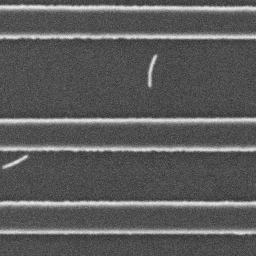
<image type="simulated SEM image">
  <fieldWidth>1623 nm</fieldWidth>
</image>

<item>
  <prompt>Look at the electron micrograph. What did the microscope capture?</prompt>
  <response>lines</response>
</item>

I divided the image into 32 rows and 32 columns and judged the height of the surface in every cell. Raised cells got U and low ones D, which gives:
DDDDDDDDDDDDDDDDDDDDDDDDDDDDDDDD
UUUUUUUUUUUUUUUUUUUUUUUUUUUUUUUU
UUUUUUUUUUUUUUUUUUUUUUUUUUUUUUUU
UUUUUUUUUUUUUUUUUUUUUUUUUUUUUUUU
UUUUUUUUUUUUUUUUUUUUUUUUUUUUUUUU
DDDDDDDDDDDDDDDDDDDDDDDDDDDDDDDD
DDDDDDDDDDDDDDDDDDDDDDDDDDDDDDDD
DDDDDDDDDDDDDDDDDDDDDDDDDDDDDDDD
DDDDDDDDDDDDDDDDDDDDDDDDDDDDDDDD
DDDDDDDDDDDDDDDDDDDDDDDDDDDDDDDD
DDDDDDDDDDDDDDDDDDDDDDDDDDDDDDDD
DDDDDDDDDDDDDDDDDDDDDDDDDDDDDDDD
DDDDDDDDDDDDDDDDDDDDDDDDDDDDDDDD
DDDDDDDDDDDDDDDDDDDDDDDDDDDDDDDD
DDDDDDDDDDDDDDDDDDDDDDDDDDDDDDDD
UUUUUUUUUUUUUUUUUUUUUUUUUUUUUUUU
UUUUUUUUUUUUUUUUUUUUUUUUUUUUUUUU
UUUUUUUUUUUUUUUUUUUUUUUUUUUUUUUU
UUUUUUUUUUUUUUUUUUUUUUUUUUUUUUUU
DDDDDDDDDDDDDDDDDDDDDDDDDDDDDDDD
DDDDDDDDDDDDDDDDDDDDDDDDDDDDDDDD
DDDDDDDDDDDDDDDDDDDDDDDDDDDDDDDD
DDDDDDDDDDDDDDDDDDDDDDDDDDDDDDDD
DDDDDDDDDDDDDDDDDDDDDDDDDDDDDDDD
DDDDDDDDDDDDDDDDDDDDDDDDDDDDDDDD
UUUUUUUUUUUUUUUUUUUUUUUUUUUUUUUU
UUUUUUUUUUUUUUUUUUUUUUUUUUUUUUUU
UUUUUUUUUUUUUUUUUUUUUUUUUUUUUUUU
UUUUUUUUUUUUUUUUUUUUUUUUUUUUUUUU
DDDDDDDDDDDDDDDDDDDDDDDDDDDDDDDD
DDDDDDDDDDDDDDDDDDDDDDDDDDDDDDDD
DDDDDDDDDDDDDDDDDDDDDDDDDDDDDDDD